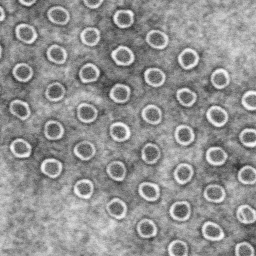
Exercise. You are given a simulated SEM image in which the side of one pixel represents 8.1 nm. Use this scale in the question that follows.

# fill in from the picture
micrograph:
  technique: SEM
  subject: a regular array of raised bodies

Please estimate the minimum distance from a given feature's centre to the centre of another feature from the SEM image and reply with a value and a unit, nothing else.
37 pixels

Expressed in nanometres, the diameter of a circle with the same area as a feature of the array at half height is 146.